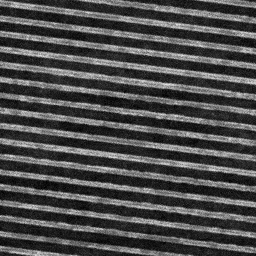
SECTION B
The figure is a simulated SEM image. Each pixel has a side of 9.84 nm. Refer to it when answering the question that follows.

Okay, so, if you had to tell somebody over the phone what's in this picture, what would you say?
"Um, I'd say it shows parallel lines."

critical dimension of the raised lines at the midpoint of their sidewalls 47.5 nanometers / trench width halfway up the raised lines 106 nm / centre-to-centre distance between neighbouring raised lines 150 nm